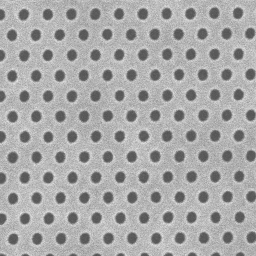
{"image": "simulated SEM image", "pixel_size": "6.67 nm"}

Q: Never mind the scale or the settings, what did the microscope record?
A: a regular array of holes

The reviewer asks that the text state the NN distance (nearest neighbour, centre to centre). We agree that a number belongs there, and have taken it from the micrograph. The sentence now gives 156 nanometres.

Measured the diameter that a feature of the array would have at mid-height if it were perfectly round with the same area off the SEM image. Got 73.3 nm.